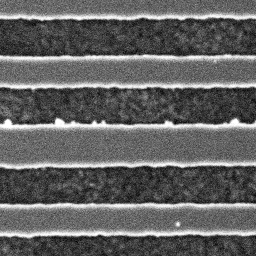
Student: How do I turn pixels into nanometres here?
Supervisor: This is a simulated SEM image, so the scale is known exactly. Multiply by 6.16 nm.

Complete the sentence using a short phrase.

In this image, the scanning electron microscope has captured lines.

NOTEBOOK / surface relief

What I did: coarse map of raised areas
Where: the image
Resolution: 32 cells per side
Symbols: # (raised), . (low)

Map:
################################
################################
................................
................................
................................
................................
................................
################################
################################
################################
################################
................................
................................
................................
................................
.........#..............#...###.
################################
################################
################################
################################
################################
................................
................................
................................
................................
.......##..#......##..###..#.###
################################
################################
################################
..##............................
................................
................................